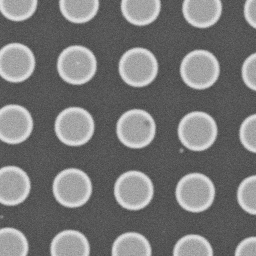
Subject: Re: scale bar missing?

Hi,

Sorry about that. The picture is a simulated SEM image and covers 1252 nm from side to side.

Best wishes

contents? an array of small figures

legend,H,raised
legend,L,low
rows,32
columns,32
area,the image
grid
HHHHHLLHHHHHLLLHHHHHLLLHHHHHLLLH
HHHHLLLLHHHHLLLHHHHHLLLHHHHHLLLH
LLHLLLLLLHHLLLLLHHHLLLLHHHHLLLLH
LLLLLLLLLLLLLLLLLLLLLLLLLLLLLLLL
LLLLLLLLLLLLLLLLLLLLLLLLLLLLLLLL
LHLLLLLLLLLLLLLLLLLLLLLLLLLLLLLL
HHHHLLLLHHHLLLLLHHHLLLLLHHLLLLLL
HHHHLLLHHHHHLLLHHHHHLLLHHHHLLLLH
HHHHLLLHHHHHLLLHHHHHLLLHHHHLLLHH
HHHHLLLLHHHHLLLHHHHLLLLHHHHLLLHH
LLLLLLLLLHLLLLLLHHHLLLLHHHHLLLLH
LLLLLLLLLLLLLLLLLLLLLLLLLLLLLLLL
LLLLLLLLLLLLLLLLLLLLLLLLLLLLLLLL
HHHLLLLLLHLLLLLLLLLLLLLLLLLLLLLL
HHHHLLLHHHHLLLLHHHHLLLLHHHLLLLLH
HHHHLLLHHHHHLLLHHHHLLLHHHHHLLLHH
HHHHLLLHHHHHLLLHHHHLLLHHHHHLLLHH
HHHLLLLLHHHLLLLHHHHLLLLHHHHLLLHH
LLLLLLLLLLLLLLLLLLLLLLLLHHLLLLLH
LLLLLLLLLLLLLLLLLLLLLLLLLLLLLLLL
LLLLLLLLLLLLLLLLLLLLLLLLLLLLLLLL
HHHLLLLLHHLLLLLLHLLLLLLLLLLLLLLL
HHHHLLLHHHHLLLLHHHHLLLLHHHLLLLLH
HHHHLLLHHHHLLLHHHHHLLLHHHHHLLLHH
HHHLLLLHHHHLLLHHHHHLLLHHHHHLLLHH
HHLLLLLLHHLLLLLHHHLLLLHHHHLLLLHH
LLLLLLLLLLLLLLLLLLLLLLLLHLLLLLLH
LLLLLLLLLLLLLLLLLLLLLLLLLLLLLLLL
LLLLLLLLLLLLLLLLLLLLLLLLLLLLLLLL
HHHLLLLHHHHLLLLHHHLLLLLHHLLLLLLL
HHHLLLHHHHHLLLHHHHHLLLHHHHLLLLHH
HHHLLLHHHHHLLLHHHHHLLLHHHHHLLHHH